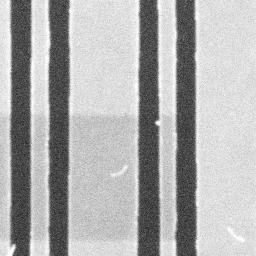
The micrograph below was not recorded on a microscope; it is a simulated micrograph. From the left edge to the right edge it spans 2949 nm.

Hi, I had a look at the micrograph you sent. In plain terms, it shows lines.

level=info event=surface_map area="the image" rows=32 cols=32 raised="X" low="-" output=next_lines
X---XX---XXXXXXXX---XX---XXXXXXX
X---XX---XXXXXXXX---XX---XXXXXXX
X---XX---XXXXXXXX---XX---XXXXXXX
X---XX---XXXXXXXX---XX---XXXXXXX
X---XX---XXXXXXXX---XX---XXXXXXX
X---XX---XXXXXXXX---XX---XXXXXXX
X---XX---XXXXXXXX---XX---XXXXXXX
X---XX---XXXXXXXX---XX---XXXXXXX
X---XX---XXXXXXXX---XX---XXXXXXX
X---XX---XXXXXXXX---XX---XXXXXXX
X---XX---XXXXXXXX---XX---XXXXXXX
X---XX---XXXXXXXX---XX---XXXXXXX
X---XX---XXXXXXXX---XX---XXXXXXX
X---XX---XXXXXXXX---XX---XXXXXXX
X---XX---XXXXXXXX---XX---XXXXXXX
X---XX---XXXXXXXX---XX---XXXXXXX
X---XX---XXXXXXXX---XX---XXXXXXX
X---XX---XXXXXXXX---XX---XXXXXXX
X---XX---XXXXXXXX---XX---XXXXXXX
X---XX---XXXXXXXX---XX---XXXXXXX
X---XX---XXXXXXXX---XX---XXXXXXX
X---XX---XXXXXXXX---XX---XXXXXXX
X---XX---XXXXXXXX---XX---XXXXXXX
X---XX---XXXXXXXX---XX---XXXXXXX
X---XX---XXXXXXXX---XX---XXXXXXX
X---XX---XXXXXXXX---XX---XXXXXXX
X---XX---XXXXXXXX---XX---XXXXXXX
X---XX---XXXXXXXX---XX---XXXXXXX
X---XX---XXXXXXXX---XX---XXXXXXX
X---XX---XXXXXXXX---XX---XXXXXXX
X---XX---XXXXXXXX---XX---XXXXXXX
X---XX---XXXXXXXX---XX---XXXXXXX